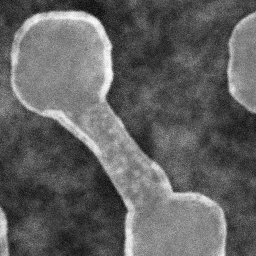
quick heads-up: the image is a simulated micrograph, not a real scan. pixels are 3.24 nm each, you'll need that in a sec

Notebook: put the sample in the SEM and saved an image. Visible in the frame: raised bodies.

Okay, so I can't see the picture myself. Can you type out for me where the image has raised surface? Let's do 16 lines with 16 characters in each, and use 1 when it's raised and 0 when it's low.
0000000000000000
0011110000000001
0111111000000011
0111111000000011
0111111000000011
0111111000000011
0011111000000001
0001111000000000
0000011100000000
0000001110000000
0000001111000000
0000000111100000
0000000011111000
0000000011111100
0000000011111100
0000000011111100